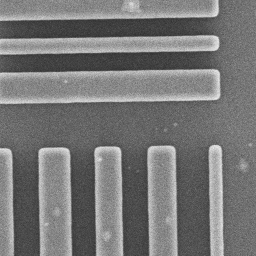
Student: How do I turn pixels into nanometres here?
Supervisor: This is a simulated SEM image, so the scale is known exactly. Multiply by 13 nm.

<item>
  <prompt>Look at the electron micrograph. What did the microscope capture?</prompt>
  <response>groups of lines, slits or small figures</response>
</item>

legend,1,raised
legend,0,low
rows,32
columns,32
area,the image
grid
11111111111111111111111111100000
11111111111111111111111111100000
11000000000000000000000000000000
00000000000000000000000000000000
00000000000000000000000000000000
11111111111111111111111111100000
11111111111111111100000000000000
00000000000000000000000000000000
00000000000000000000000000000000
11111111111111111111111111100000
11111111111111111111111111100000
11111111111111111111111111100000
11111111111111111111111100000000
00000000000000000000000000000000
00000000000000000000000000000000
00000000000000000000000000000000
00000000000000000000000000000000
00000000000000000000000000000000
00000011000011100001110000110000
10000111100011100001110000110000
10000111100011100001110000110000
10000111100011100001110000110000
10000111100011100001110000110000
10000111100011100001110000110000
10000111100011100001110000110000
10000111100011100001110000110000
11000111100011100001110000110000
11000111100011100001110000110000
11000111100011100001110000110000
11000111100011100001110000110000
11000111100011100001110000110000
11000111100011100001110000110000